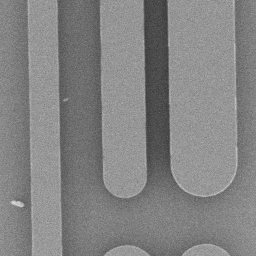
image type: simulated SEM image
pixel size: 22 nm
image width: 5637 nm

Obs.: groups of lines, slits or small figures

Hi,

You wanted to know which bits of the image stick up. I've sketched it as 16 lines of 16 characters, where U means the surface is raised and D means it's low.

DDUUDDUUUDUUUUUD
DDUUDDUUUDDUUUUD
DDUUDDUUUDDUUUUD
DDUUDDUUUDDUUUUD
DDUUDDUUUDDUUUUD
DDUUDDUUUDDUUUUD
DDUUDDUUUDDUUUUD
DDUUDDUUUDDUUUUD
DDUUDDUUUDDUUUUD
DDUUDDUUUDDUUUUD
DDUUDDUUUDDUUUUD
DDUUDDDUUDDUUUDD
DDUUDDDDDDDDDDDD
DDUUDDDDDDDDDDDD
DDUUDDDDDDDDDDDD
DDUUDDDUUDDDUUDD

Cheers